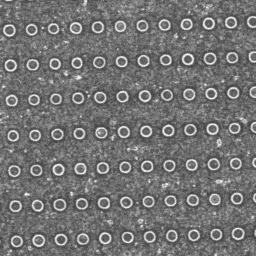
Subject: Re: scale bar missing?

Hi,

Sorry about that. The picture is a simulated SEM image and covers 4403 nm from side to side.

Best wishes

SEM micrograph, a regular array of raised bodies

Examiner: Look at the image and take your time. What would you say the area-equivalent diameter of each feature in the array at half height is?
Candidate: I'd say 0.179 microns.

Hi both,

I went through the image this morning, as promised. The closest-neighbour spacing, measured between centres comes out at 379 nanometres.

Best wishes